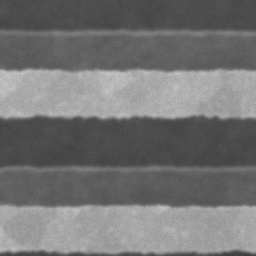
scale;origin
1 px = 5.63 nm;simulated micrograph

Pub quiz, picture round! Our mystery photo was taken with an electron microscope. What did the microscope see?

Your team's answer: lines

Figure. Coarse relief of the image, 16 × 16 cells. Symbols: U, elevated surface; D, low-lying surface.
DDDDDDDDDDDDDDDD
DDDDDDDDDDDDDDDD
UUUUUUUUUUUUUUUU
UUUUUUUUUUUUUUUU
UUUUUUUUUUUUUUUU
UUUUUUUUUUUUUUUU
UUUUUUUUUUUUUUUU
DDDDDDDDDDDDDDDD
DDDDDDDDDDDDDDDD
DDDDDDDDDDDDDDDD
DUDDDDDDDDDDDDDD
UUUUUUUUUUUUUUUU
UUUUUUUUUUUUUUUU
UUUUUUUUUUUUUUUU
UUUUUUUUUUUUUUUU
UUUUUUUUUUUUUUUU